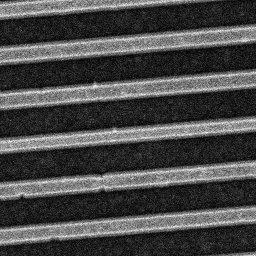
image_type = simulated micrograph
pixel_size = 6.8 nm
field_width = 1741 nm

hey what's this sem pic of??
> parallel lines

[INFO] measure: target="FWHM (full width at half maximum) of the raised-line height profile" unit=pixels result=14.6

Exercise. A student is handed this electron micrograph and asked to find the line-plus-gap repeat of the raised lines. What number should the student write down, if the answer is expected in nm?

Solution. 306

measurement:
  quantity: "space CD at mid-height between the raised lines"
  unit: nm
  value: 209